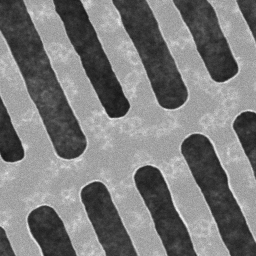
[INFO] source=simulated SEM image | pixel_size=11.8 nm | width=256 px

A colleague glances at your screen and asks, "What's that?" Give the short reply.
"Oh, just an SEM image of holes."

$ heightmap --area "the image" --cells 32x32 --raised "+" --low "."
...++++...++++.....+++....++++..
....+++....++++....+++.....+++..
....++++...++++.....+++....++++.
....++++....++++....++++....+++.
.....+++....++++....++++....++++
+....++++....++++....+++.....+++
+.....++++...++++....++++....+++
++....++++....++++....+++....+++
++.....+++....++++....++++....++
+++....++++....+++.....+++...+++
+++.....+++....++++....+++++++++
+++.....++++...++++....+++++++++
++++....++++....++++...+++++++++
.++++....++++...++++..++++++++++
.++++....+++++.+++++++++++++++..
..+++.....+++++++++++++++++++...
..++++....+++++++++++++++++++...
...+++.....++++++++++++...++++..
...++++....++++++++++++....+++..
...++++...+++++++++++++....++++.
+++++++++++++++++++++++.....+++.
+++++++++++++++++...++++....++++
+++++++++++++++++....+++....++++
++++++++++...++++....++++....+++
++++++++++....++++...++++....+++
++++++++++....++++....++++....++
++++...++++....++++...++++....++
+++.....+++....++++....++++....+
++++....++++....+++....++++....+
.+++.....+++....++++....++++....
.++++....++++....+++....++++....
..+++....++++....++++...+++++...